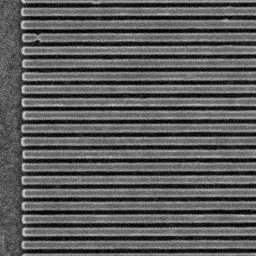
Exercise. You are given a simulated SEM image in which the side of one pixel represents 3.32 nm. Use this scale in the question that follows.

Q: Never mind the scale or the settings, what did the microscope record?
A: parallel lines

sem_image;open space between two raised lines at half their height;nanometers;19.1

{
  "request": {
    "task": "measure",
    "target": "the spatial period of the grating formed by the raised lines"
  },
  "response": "43 nanometres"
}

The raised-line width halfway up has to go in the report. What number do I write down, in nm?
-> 22